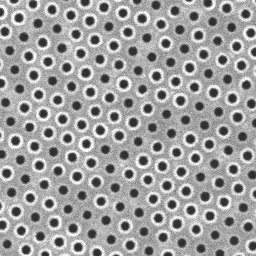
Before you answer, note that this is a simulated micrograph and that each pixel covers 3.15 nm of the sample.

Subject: a regular array of holes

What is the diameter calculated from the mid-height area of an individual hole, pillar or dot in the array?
0.0275 microns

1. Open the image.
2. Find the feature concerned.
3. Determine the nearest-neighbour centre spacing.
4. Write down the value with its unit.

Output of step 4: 0.0611 um